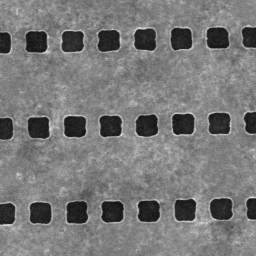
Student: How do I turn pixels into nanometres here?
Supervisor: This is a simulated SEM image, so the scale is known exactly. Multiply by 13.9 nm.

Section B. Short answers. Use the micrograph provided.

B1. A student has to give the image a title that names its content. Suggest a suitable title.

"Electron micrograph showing a regular array of holes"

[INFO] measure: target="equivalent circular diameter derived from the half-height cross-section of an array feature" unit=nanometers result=328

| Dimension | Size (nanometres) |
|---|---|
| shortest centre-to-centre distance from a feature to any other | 500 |